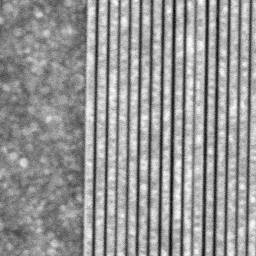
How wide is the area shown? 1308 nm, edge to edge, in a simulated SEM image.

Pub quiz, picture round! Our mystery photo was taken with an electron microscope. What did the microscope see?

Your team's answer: parallel lines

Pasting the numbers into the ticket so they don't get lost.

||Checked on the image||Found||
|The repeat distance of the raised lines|55.9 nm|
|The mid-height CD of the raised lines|42.8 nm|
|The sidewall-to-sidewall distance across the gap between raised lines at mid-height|12.8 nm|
